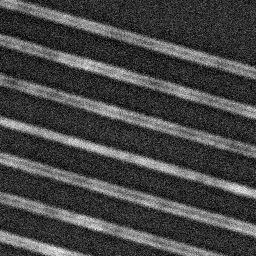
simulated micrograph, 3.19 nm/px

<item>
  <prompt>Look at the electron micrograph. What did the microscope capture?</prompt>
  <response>parallel lines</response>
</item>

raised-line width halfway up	31	nm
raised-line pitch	37.8	px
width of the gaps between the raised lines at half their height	90.4	nm